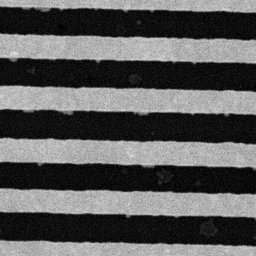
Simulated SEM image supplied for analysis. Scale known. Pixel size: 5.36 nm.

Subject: lines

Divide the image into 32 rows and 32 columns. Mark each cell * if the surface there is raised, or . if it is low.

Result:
********************************
................................
................................
................................
*****.*.........................
********************************
********************************
..............******************
................................
................................
................................
********************************
********************************
********************************
................................
................................
................................
***...*.........................
********************************
********************************
...............*****************
................................
................................
................................
********************************
********************************
......**************************
................................
................................
................................
****************................
********************************